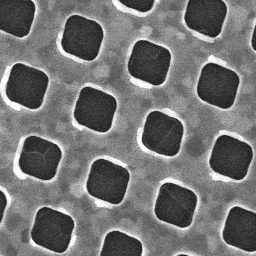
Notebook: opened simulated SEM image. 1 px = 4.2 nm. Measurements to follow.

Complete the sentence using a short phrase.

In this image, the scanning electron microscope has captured a regular array of holes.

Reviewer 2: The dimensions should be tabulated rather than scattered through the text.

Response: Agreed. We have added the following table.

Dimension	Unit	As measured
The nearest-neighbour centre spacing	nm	302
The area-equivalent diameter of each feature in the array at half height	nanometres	185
